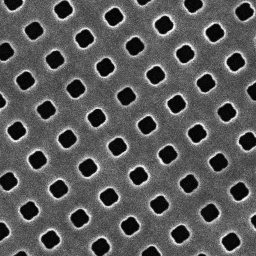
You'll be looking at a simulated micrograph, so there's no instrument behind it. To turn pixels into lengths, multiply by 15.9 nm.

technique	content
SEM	a regular array of holes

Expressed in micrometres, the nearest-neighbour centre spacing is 0.568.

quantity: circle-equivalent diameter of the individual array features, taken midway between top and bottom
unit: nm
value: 280